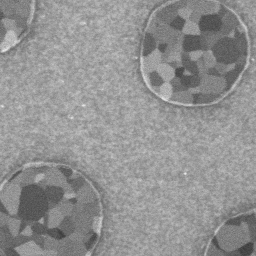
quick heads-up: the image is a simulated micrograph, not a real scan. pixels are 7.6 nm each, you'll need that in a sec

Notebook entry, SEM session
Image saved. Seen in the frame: raised bodies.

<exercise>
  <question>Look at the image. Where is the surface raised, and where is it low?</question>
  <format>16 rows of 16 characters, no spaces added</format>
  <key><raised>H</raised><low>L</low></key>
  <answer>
HHLLLLLLLLHHHHLL
HHLLLLLLLHHHHHHL
HLLLLLLLLHHHHHHH
LLLLLLLLLHHHHHHH
LLLLLLLLLHHHHHHL
LLLLLLLLLHHHHHHL
LLLLLLLLLLLHHLLL
LLLLLLLLLLLLLLLL
LLLLLLLLLLLLLLLL
LLLLLLLLLLLLLLLL
LHHHLLLLLLLLLLLL
HHHHHHLLLLLLLLLL
HHHHHHLLLLLLLLLL
HHHHHHLLLLLLLLLH
HHHHHHLLLLLLLHHH
HHHHHHLLLLLLLHHH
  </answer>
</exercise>